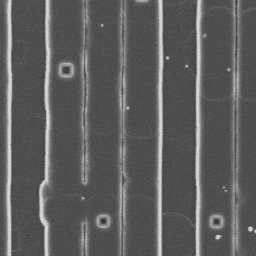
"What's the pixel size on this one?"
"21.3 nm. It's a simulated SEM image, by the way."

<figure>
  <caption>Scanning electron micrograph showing wiring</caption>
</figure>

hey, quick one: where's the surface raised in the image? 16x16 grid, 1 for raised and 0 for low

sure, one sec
1001111111001111
1001111111001111
1001111111001111
1001111111001111
1001111111001111
1001111111001111
1001111111001111
1001111111001111
1001111111001111
1001111111001111
1001111111001111
1001111111001111
1001111111001111
1001111111001111
1001111111001111
1001111111001111